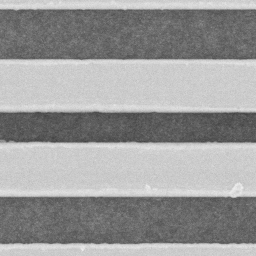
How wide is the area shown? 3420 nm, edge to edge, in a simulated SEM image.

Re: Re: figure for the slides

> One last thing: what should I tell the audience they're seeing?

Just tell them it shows lines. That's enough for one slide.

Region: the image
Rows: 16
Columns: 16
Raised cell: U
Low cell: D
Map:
UUUUUUUUUUUUUUUU
DDDDDDDDDDDDDDDD
DDDDDDDDDDDDDDDD
DDDDDDDDDDDDDDDD
UUUUUUUUUUUUUUUU
UUUUUUUUUUUUUUUU
UUUUUUUUUUUUUUUU
DDDDDDDDDDDDDDDD
DDDDDDDDDDDDDDDD
UUUUUUUUUUUUUUUU
UUUUUUUUUUUUUUUU
UUUUUUUUUUUUUUUU
DDDDDDDDDDDDDDDD
DDDDDDDDDDDDDDDD
DDDDDDDDDDDDDDDD
UUUUUUUUUUUUUUUU